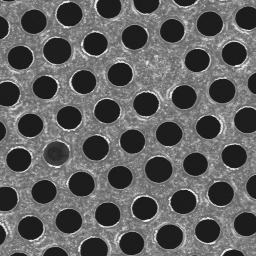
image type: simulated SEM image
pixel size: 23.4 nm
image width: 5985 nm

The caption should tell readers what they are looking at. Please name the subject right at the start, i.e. a regular array of holes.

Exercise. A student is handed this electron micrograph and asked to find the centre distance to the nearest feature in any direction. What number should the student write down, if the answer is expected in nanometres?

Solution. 880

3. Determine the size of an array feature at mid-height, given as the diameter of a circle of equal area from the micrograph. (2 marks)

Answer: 582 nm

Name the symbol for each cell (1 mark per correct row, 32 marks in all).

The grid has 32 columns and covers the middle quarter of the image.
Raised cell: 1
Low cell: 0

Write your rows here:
11111111111100001111111111111100
11111111111000000111111111111110
11100001111000000111111111111111
11000000111000000111111111111111
11000000111000000111111111111111
11000000111110011111111111111001
11100001111111111111111111100000
11110011111111111110001111100000
11111111111111111100000111100000
11111111100001111000000011100000
10111111000000111000000011110000
00001111000000111100000111111111
00001111000000111110001111111111
00001111000000111111111111111111
00001111100011111111111110011111
00011111111111111111111100000111
11111111111111110011111000000111
11111111111111100000111000000011
11111100001111000000111000000111
11111000000111000000111100000111
11111000000111000000111110011111
11111000000111100001111111111111
01111000000111111111111111111110
01111100001111111111110001111100
11111111111111111111100000011100
11111111111111011111000000011100
11111111111100001111000000011100
11000011111000000111000000011110
11000001111000000111100000111111
10000000111000000111110001111111
10000000111100001111111111111111
10000001111111111111111111111001